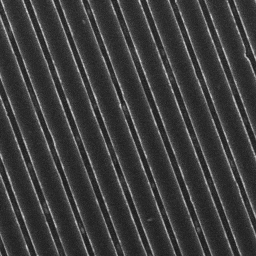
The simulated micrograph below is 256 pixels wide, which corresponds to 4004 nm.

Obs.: parallel lines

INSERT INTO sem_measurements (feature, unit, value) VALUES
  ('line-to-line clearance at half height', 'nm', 95.4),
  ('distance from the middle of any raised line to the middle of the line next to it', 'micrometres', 0.427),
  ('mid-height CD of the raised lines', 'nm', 336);